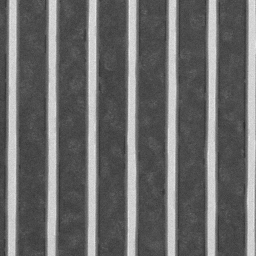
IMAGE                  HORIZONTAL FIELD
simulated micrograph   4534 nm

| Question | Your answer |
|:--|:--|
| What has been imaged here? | parallel lines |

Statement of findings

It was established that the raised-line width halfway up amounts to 168 nm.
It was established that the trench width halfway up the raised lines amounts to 536 nm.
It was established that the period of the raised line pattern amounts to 707 nanometers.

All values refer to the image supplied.